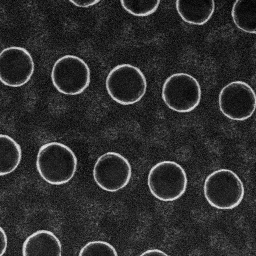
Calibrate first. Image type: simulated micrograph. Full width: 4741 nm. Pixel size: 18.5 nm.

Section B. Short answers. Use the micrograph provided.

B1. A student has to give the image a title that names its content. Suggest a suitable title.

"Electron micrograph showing raised bodies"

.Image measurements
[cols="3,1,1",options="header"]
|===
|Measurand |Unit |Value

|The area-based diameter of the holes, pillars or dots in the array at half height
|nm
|706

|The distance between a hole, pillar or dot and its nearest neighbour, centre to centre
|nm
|1040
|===